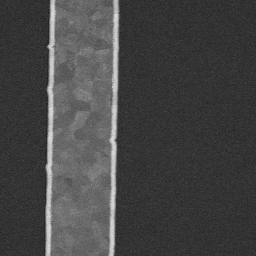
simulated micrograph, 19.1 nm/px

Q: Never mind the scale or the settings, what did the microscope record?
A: one or a few lines or trenches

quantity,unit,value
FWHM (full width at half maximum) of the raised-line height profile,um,1.21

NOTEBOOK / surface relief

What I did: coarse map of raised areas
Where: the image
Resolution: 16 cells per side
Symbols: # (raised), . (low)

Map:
...####.........
...####.........
...####.........
...####.........
...####.........
...####.........
...####.........
...####.........
...####.........
...####.........
...####.........
...####.........
...####.........
...####.........
...####.........
...####.........